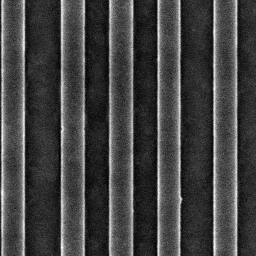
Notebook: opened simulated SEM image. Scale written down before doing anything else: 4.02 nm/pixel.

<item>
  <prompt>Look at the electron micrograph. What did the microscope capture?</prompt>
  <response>parallel lines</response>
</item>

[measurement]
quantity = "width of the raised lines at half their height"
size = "92.5 nm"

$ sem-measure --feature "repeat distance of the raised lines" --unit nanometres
214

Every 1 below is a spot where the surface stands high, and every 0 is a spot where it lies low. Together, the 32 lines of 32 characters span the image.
11100000111000111000110000011100
11100000111000111000110000011100
11100000111000111000110000011100
11100000111000111000110000011100
11100000111000111000110000011100
11100000111000111000110000011100
11100000111000111000110000011100
11100000111000111000110000011100
11100000111000111000110000011100
11100000111000111000110000011100
11100000111000111000110000011100
11100000111000111000110000011100
11100000111000111000110000011100
11100000111000111000110000011100
11100000111000111000110000011100
11100000111000111000110000011100
11100000111000111000110000011100
11100000111000111000110000011100
11100000111000111000110000011100
11100000111000111000110000011100
11100000111000111000110000011100
11100000111000111000110000011100
11100000111000111000110000011100
11100000111000111000110000011100
11100000111000111000111000011100
11100000111000111000111000011100
11100000111000111000110000011100
11100000111000111000110000011100
11100000111000111000110000011100
11100000111000111000110000011100
11100000111000111000110000011100
11100000111000111000110000011100